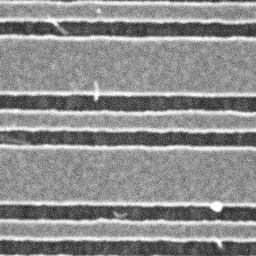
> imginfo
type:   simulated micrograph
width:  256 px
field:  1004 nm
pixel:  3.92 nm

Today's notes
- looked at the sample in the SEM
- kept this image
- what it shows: lines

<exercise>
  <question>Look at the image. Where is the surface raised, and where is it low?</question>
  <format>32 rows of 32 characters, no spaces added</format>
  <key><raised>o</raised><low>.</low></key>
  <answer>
oooooooooooooooooooooooooooooooo
oooooooooooooooooooooooooooooooo
oooooooooooooooooooooooooooooooo
................................
ooooo.o.........................
oooooooooooooooooooooooooooooooo
oooooooooooooooooooooooooooooooo
oooooooooooooooooooooooooooooooo
oooooooooooooooooooooooooooooooo
oooooooooooooooooooooooooooooooo
oooooooooooooooooooooooooooooooo
oooooooooooooooooooooooooooooooo
................................
................................
oooooooooooooooooooooooooooooooo
oooooooooooooooooooooooooooooooo
................................
................................
oooooooooooooooooooooooooooooooo
oooooooooooooooooooooooooooooooo
oooooooooooooooooooooooooooooooo
oooooooooooooooooooooooooooooooo
oooooooooooooooooooooooooooooooo
oooooooooooooooooooooooooooooooo
oooooooooooooooooooooooooooooooo
....oooooooooooooooooooooooooooo
................................
............o...................
oooooooooooooooooooooooooooooooo
oooooooooooooooooooooooooooooooo
................................
................................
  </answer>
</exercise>